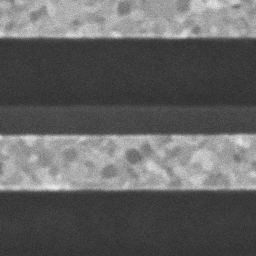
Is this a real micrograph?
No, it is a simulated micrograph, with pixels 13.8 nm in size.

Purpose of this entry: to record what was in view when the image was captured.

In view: lines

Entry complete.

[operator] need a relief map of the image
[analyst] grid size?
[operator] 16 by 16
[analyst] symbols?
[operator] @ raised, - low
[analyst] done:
@@@@@@@@@@@@@@@@
@@@@@@@@@@@@@@@@
----------------
----------------
----------------
----------------
----------------
----------------
---------@---@@@
@@@@@@@@@@@@@@@@
@@@@@@@@@@@@@@@@
@@@@@@@@@@@@@@@@
----------------
----------------
----------------
----------------